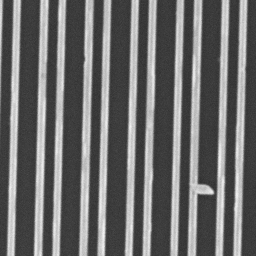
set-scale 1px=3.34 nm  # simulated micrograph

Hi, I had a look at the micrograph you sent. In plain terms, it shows parallel lines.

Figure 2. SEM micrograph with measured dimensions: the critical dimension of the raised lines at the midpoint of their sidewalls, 23.4 nm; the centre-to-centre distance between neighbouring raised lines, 75.6 nm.